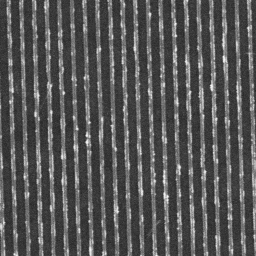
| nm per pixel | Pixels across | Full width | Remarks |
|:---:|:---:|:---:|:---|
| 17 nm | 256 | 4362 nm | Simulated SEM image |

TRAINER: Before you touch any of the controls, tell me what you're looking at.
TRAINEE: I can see parallel lines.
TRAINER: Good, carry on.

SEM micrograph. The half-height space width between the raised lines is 160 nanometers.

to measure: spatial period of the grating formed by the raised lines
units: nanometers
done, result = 216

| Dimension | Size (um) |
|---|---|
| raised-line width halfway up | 0.0564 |